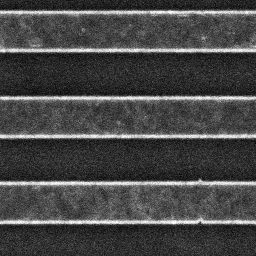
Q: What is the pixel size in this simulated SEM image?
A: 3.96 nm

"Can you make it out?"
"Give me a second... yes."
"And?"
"one or a few lines or trenches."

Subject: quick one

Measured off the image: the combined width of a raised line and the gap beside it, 339 nm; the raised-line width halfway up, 153 nm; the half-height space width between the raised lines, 186 nm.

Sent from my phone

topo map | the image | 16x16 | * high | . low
................
****************
****************
................
................
................
****************
****************
................
................
................
....*.......****
****************
****************
................
................